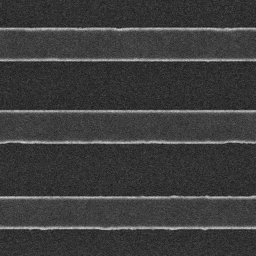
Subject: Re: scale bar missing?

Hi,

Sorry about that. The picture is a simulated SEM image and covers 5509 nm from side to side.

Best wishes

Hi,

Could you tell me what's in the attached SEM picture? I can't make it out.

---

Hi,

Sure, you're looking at lines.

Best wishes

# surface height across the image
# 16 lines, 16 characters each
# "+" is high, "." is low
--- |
................
................
++++++++++++++++
++++++++++++++++
................
................
................
++++++++++++++++
++++++++++++++++
................
................
................
++++++++++++++++
++++++++++++++++
................
................